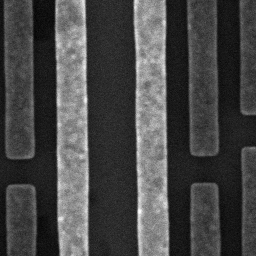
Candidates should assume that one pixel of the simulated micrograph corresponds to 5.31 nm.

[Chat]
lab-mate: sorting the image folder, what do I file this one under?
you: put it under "wiring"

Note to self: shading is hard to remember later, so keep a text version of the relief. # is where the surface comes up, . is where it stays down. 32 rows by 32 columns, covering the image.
.###...####......####..####...##
.###...####......####..####...##
.###...####......####..####...##
.###...####......####...###...##
.###...####......####...###...##
.###...####......####...###...##
.###...####......####...###...##
.###...####......####...###...##
.###...####......####...###...##
.###...####......####...###...##
.###...####......####...###...##
.###...####......####...###...##
.###...####......####...###...##
.###...####......####...###...##
.###...####......####...###.....
.###...####......####...###.....
.###...####......####...###.....
.###...####......####...###.....
.###...####......####...###....#
.###...####......####....#....##
.......####......####.........##
.......####......####.........##
.......####......####.........##
.###...####......####...###...##
.###...####......####...###...##
.###...####......####...###...##
.####..####......####...###...##
.####..####......####...###...##
.####..####......####...###...##
.####..####......####...###...##
.###...####......####...###...##
.###....###......####...###...##